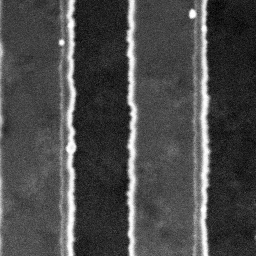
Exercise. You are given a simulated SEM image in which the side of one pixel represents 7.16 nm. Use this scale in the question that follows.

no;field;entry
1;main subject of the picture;lines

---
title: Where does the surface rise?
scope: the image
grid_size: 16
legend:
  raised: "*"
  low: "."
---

****....*****...
****....*****...
****....*****...
****....*****...
****....*****...
*****...*****...
*****...*****...
****....*****...
****....*****...
*****...*****...
****....*****...
****....*****...
****....*****...
****....*****...
****....*****...
****....*****...